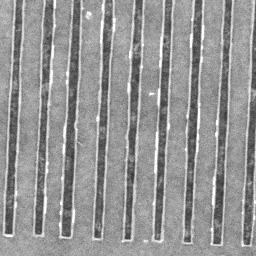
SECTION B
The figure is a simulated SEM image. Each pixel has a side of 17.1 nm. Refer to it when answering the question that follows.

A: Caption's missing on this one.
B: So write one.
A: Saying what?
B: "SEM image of parallel lines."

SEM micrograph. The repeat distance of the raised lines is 510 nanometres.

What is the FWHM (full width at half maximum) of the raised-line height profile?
154 nm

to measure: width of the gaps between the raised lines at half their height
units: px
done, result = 20.6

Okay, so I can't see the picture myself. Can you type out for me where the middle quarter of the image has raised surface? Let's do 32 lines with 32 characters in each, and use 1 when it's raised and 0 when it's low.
01110000001000000110000011000000
01110000001000000110000011000000
01110000011000000110000011000000
01110000011000000110000011000000
01110000011000000110000011000000
01110000011000000110000011000000
01110000011000000110000011000000
01100000011000001110000011000000
01100000011000001110000011000000
01100000011000001110000011000001
01100000011000001110000011000001
01100000011000001110000011000001
01100000011000001110000011000001
01100000011000001100000011000001
01100000011000001100000011000001
01100000011000001100000011000001
01100000011000001100000111000001
01100000011000001100000111000001
11100000011000001100000111000001
11100000111000001100000011000001
11100000111000001100000011000001
11100000110000001100000111000001
11100000110000001100000110000001
11100000110000001100000110000001
11100000111000001100000110000001
11100000110000001100000110000001
11100000110000001100000110000001
11100000110000001100000110000001
11000000110000011100000110000001
11000000110000011000000110000001
11000000110000001000000110000011
11000000110000001000000110000011